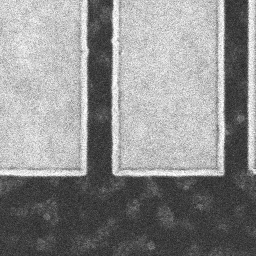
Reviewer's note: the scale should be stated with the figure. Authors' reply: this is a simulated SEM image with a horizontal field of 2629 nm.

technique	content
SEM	one or a few lines or trenches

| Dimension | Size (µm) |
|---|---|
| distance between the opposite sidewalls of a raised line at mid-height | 0.32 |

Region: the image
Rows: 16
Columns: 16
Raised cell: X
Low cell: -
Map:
-----XX-------XX
-----XX-------XX
-----XX-------XX
-----XX-------XX
-----XX-------XX
-----XX-------XX
-----XX-------XX
-----XX-------XX
-----XX-------XX
-----XX-------XX
-----XX-------XX
XXXXXXXXXXXXXXXX
XXXXXXXXXXXXXXXX
XXXXXXXXXXXXXXXX
XXXXXXXXXXXXXXXX
XXXXXXXXXXXXXXXX